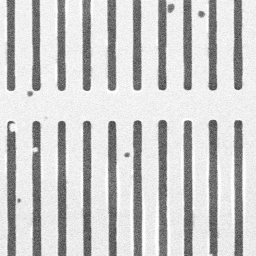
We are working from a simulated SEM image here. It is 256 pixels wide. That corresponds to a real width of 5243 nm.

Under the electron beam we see groups of lines, slits or small figures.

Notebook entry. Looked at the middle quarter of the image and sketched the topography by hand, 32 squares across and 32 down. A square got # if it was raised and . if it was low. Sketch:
.####..####..####...###...####..
.####..####..####...###...####..
.####..####..####...###...####..
.####..####..####...###...####..
.####..####..####...###...####..
.####..####..####...###...####..
#####..####..####..#####.#####..
################################
################################
################################
################################
################################
################################
################################
#####.#####..####..#####..####..
.####..####..####...###...####..
.####..####..####...###...####..
.####..####..####...###...####..
.####..####..####...###...####..
.####..####..####...###...####..
.####..####..####...###...###...
.####..####..####...###...###...
.####..####..####...####..###...
.####..####..####...####..###...
.####..####..####...####..###...
.####..####..####...####..###...
.####..####..####...####..###...
.####..####..####...####..###...
.####..####...###...####..###...
.####..####...###...####..###...
.####..####...###...####..###...
.####..####...###...###...####..